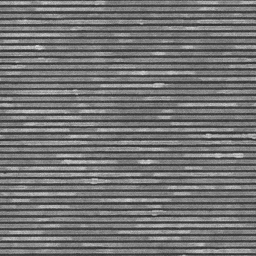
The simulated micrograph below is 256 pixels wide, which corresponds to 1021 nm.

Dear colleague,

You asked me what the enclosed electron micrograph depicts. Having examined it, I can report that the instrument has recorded parallel lines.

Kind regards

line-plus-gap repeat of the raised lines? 25.4 nm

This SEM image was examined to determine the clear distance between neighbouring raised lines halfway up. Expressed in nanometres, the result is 14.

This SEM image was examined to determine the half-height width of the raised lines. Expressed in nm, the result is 11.